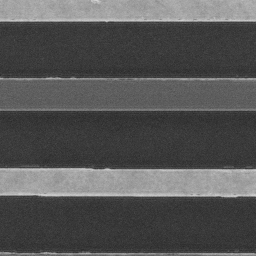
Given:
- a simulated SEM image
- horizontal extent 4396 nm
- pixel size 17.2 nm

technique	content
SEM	lines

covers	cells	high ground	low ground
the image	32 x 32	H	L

HHHHHHHHHHHHHHHHHHHHHHHHHHHHHHHH
HHHHHHHHHHHHHHHHHHHHHHHHHHHHHHHH
HHHHHHHHHHHHHHHHHHHHHHHHHHHHHHHH
LLLLLLLLLLLLLLLLLLLLLLLLLLLLLLLL
LLLLLLLLLLLLLLLLLLLLLLLLLLLLLLLL
LLLLLLLLLLLLLLLLLLLLLLLLLLLLLLLL
LLLLLLLLLLLLLLLLLLLLLLLLLLLLLLLL
LLLLLLLLLLLLLLLLLLLLLLLLLLLLLLLL
LLLLLLLLLLLLLLLLLLLLLLLLLLLLLLLL
LLLLLLLLLLLLLLLLLLLLLLLLLLLLLLLL
HHHHHHHHHHHHHHHHHHHHHHHHHHHHHHHH
HHHHHHHHHHHHHHHHHHHHHHHHHHHHHHHH
HHHHHHHHHHHHHHHHHHHHHHHHHHHHHHHH
HHHHHHHHHHHHHHHHHHHHHHHHHHHHHHHH
LLLLLLLLLLLLLLLLLLLLLLLLLLLLLLLL
LLLLLLLLLLLLLLLLLLLLLLLLLLLLLLLL
LLLLLLLLLLLLLLLLLLLLLLLLLLLLLLLL
LLLLLLLLLLLLLLLLLLLLLLLLLLLLLLLL
LLLLLLLLLLLLLLLLLLLLLLLLLLLLLLLL
LLLLLLLLLLLLLLLLLLLLLLLLLLLLLLLL
LLLLLLLLLLLLLLLLLLLLLLLLLLLLLLLL
HHHHHHHHHHHHHHHHHHHHHHHHHHHHHHHH
HHHHHHHHHHHHHHHHHHHHHHHHHHHHHHHH
HHHHHHHHHHHHHHHHHHHHHHHHHHHHHHHH
LLLLLLLLLLLLLLLLLLLLLLLLLLLLLLLL
LLLLLLLLLLLLLLLLLLLLLLLLLLLLLLLL
LLLLLLLLLLLLLLLLLLLLLLLLLLLLLLLL
LLLLLLLLLLLLLLLLLLLLLLLLLLLLLLLL
LLLLLLLLLLLLLLLLLLLLLLLLLLLLLLLL
LLLLLLLLLLLLLLLLLLLLLLLLLLLLLLLL
LLLLLLLLLLLLLLLLLLLLLLLLLLLLLLLL
LLLLLLLLLLLLLLLLLLLLLLLLLLLLLLLL